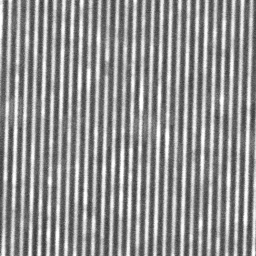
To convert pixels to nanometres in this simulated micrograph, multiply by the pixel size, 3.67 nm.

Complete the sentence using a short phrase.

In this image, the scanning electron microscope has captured parallel lines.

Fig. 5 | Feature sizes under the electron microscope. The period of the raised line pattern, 0.0328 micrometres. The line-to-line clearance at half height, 25.7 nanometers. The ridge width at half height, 8.2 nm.